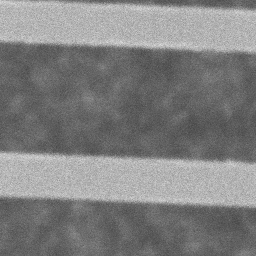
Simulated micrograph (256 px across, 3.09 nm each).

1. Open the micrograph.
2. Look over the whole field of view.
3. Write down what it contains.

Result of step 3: one or a few lines or trenches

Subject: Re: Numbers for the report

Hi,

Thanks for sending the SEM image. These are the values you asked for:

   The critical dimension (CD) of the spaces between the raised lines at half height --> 348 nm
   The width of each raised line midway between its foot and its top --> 0.127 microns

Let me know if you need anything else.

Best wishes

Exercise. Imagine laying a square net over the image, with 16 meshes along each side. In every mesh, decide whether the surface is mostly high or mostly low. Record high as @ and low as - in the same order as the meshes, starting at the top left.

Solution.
@@@@@@@@@@@@----
@@@@@@@@@--@@@@@
@@@@@@@@@@@@@@@@
----------------
----------------
----------------
----------------
----------------
----------------
----------------
@@@@@@@@@@@@@@@@
@@@@@@@@@@@@@@@@
--------@@@@@@@@
----------------
----------------
----------------